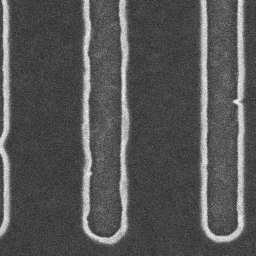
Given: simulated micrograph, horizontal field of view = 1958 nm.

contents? one or a few lines or trenches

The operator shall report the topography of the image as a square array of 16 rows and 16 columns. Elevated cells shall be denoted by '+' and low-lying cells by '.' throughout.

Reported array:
+++++...+++++..+
+++++...+++++..+
+++++...+++++..+
+++++...+++++..+
++++++..+++++..+
++++++..+++++..+
+++++...+++++..+
+++++...+++++..+
+++++...+++++..+
++++++..+++++..+
++++++..+++++..+
+++++...+++++..+
+++++...+++++..+
+++++...+++++..+
++++++.++++++..+
++++++++++++++++